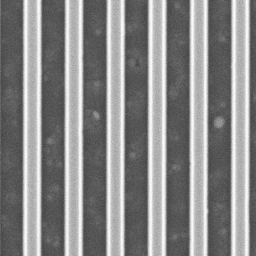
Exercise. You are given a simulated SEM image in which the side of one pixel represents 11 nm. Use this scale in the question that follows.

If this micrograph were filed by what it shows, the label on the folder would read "parallel lines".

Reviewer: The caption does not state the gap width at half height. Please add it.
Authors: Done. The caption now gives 295 nanometers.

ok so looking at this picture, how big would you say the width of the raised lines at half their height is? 166 nanometres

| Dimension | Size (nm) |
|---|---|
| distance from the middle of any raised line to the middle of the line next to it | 458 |